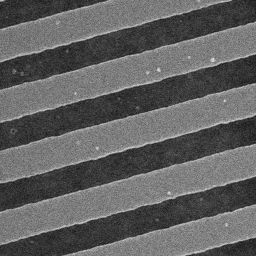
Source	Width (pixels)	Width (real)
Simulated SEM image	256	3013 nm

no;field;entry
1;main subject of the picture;lines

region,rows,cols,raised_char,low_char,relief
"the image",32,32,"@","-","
------------@@@@@@@@@@@@@@@-----
--------@@@@@@@@@@@@@@@@--------
----@@@@@@@@@@@@@@@-------------
-@@@@@@@@@@@@@@@-------------@@@
@@@@@@@@@@@@--------------@@@@@@
@@@@@@@@--------------@@@@@@@@@@
@@@@@-------------@@@@@@@@@@@@@@
@-------------@@@@@@@@@@@@@@@---
-----------@@@@@@@@@@@@@@@------
-------@@@@@@@@@@@@@@@----------
---@@@@@@@@@@@@@@@--------------
@@@@@@@@@@@@@@--------------@@@@
@@@@@@@@@@--------------@@@@@@@@
@@@@@@@--------------@@@@@@@@@@@
@@@-------------@@@@@@@@@@@@@@@@
-------------@@@@@@@@@@@@@@@----
---------@@@@@@@@@@@@@@@--------
-----@@@@@@@@@@@@@@@------------
--@@@@@@@@@@@@@@@-------------@@
@@@@@@@@@@@@@-------------@@@@@@
@@@@@@@@@@-------------@@@@@@@@@
@@@@@@-------------@@@@@@@@@@@@@
@@-------------@@@@@@@@@@@@@@@--
-----------@@@@@@@@@@@@@@@@-----
--------@@@@@@@@@@@@@@----------
----@@@@@@@@@@@@@@@-------------
@@@@@@@@@@@@@@@--------------@@@
@@@@@@@@@@@--------------@@@@@@@
@@@@@@@@-------------@@@@@@@@@@@
@@@@-------------@@@@@@@@@@@@@@@
@-------------@@@@@@@@@@@@@@@---
----------@@@@@@@@@@@@@@@-------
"